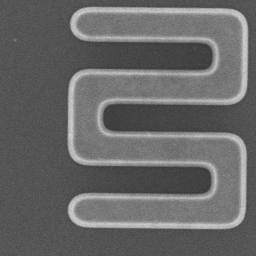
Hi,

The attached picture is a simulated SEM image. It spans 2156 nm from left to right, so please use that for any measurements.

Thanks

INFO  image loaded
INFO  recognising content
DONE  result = groups of lines, slits or small figures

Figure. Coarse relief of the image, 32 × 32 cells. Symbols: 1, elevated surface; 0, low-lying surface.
00000000000000000000000000000000
00000000001111111111111111111000
00000000011111111111111111111100
00000000011111111111111111111110
00000000001111111111111111111110
00000000000000000000000000111110
00000000000000000000000000011110
00000000000000000000000000011110
00000000000000000000000000111110
00000000001111111111111111111110
00000000011111111111111111111110
00000000011111111111111111111100
00000000011111111111111111111100
00000000011110000000000000000000
00000000011110000000000000000000
00000000011110000000000000000000
00000000011111000000000000000000
00000000011111111111111111111100
00000000011111111111111111111100
00000000011111111111111111111110
00000000000000000111111111111110
00000000000000000000000000011110
00000000000000000000000000011110
00000000000000000000000000011100
00000000001111111111111001111100
00000000011111111111111111111100
00000000011111111111111111111100
00000000011111111111111111111100
00000000000000000000000000000000
00000000000000000000000000000000
00000000000000000000000000000000
00000000000000000000000000000000